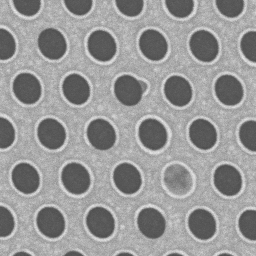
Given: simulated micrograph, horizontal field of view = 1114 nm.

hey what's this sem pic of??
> a regular array of holes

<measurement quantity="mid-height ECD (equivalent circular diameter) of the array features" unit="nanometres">129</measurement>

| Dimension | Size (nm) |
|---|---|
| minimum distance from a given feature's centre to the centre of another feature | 218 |